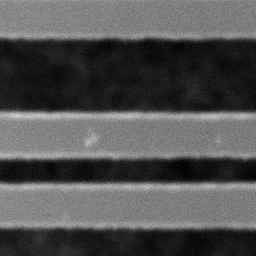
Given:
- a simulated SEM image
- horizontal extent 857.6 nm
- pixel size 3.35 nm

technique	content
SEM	lines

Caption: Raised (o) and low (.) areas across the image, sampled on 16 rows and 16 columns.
oooooooooooooooo
oooooooooooooooo
................
................
................
................
................
oooooooooooooooo
oooooooooooooooo
oooooooooooooooo
................
................
oooooooooooooooo
oooooooooooooooo
................
................